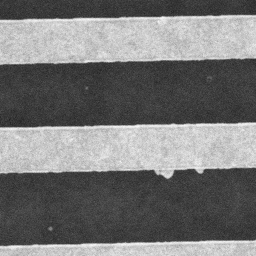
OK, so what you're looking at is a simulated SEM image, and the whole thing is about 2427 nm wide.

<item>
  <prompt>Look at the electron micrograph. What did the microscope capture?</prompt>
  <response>lines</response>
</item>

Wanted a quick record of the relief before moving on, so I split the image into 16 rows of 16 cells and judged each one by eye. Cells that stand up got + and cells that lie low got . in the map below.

................
++++++++++++++++
++++++++++++++++
++++++++++++++++
................
................
................
................
++++++++++++++++
++++++++++++++++
+++++++++++++++.
................
................
................
................
++++++++++++++++